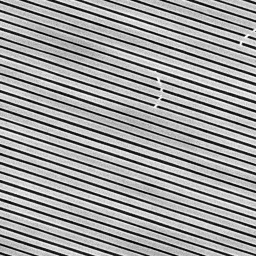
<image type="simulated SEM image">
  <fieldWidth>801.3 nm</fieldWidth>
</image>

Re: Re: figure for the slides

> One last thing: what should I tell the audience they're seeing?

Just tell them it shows parallel lines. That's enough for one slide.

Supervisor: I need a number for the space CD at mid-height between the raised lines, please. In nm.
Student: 8.2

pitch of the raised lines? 8.53 px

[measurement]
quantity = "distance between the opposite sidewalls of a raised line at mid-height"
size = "0.019 um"